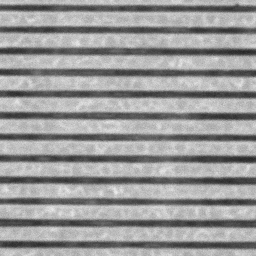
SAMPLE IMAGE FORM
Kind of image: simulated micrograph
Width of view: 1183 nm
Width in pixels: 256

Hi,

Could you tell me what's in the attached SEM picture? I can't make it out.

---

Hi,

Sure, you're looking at parallel lines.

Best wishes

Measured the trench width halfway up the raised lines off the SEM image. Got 7.88 pixels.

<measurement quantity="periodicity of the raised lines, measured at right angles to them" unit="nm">99.3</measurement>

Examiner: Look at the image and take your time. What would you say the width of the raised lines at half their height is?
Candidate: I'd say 60.7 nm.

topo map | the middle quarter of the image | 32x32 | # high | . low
################################
................................
................................
################################
################################
################################
................................
................................
................................
################################
################################
################################
................................
................................
################################
################################
################################
................................
................................
##.................####.........
################################
################################
################...#############
................................
................................
################################
################################
################################
................................
................................
################################
################################